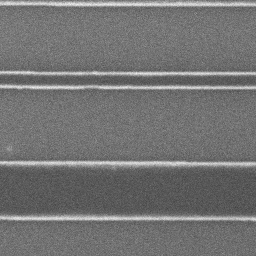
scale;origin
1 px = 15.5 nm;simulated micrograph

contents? lines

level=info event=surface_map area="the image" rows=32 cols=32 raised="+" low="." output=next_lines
.+++++++++++++++++++++++++++++++
................................
................................
................................
................................
................................
................................
................................
................................
++++++++++++++++++++++++++++++++
++++++++++++++++++++++++++++++++
................................
................................
................................
................................
................................
................................
................................
................................
................................
++++++++++++++...+++++++++++++..
++++++++++++++++++++++++++++++++
++++++++++++++++++++++++++++++++
++++++++++++++++++++++++++++++++
++++++++++++++++++++++++++++++++
++++++++++++++++++++++++++++++++
++++++++++++++++++++++++++++++++
................................
................................
................................
................................
................................